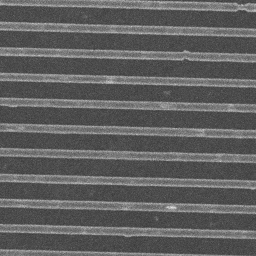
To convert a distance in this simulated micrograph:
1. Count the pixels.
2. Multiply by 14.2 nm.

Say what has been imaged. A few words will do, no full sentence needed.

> parallel lines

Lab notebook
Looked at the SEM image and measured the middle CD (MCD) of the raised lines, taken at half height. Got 112 nm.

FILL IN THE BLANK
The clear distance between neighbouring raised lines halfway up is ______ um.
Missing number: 0.239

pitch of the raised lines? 358 nanometres